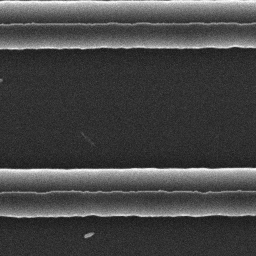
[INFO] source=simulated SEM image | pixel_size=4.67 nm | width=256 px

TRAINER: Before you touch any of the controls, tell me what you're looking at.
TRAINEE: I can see lines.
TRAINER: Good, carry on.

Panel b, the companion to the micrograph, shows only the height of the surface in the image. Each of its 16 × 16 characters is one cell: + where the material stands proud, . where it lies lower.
++++++++++++++++
++++++++++++++++
++++++++++++++++
................
................
................
................
................
................
................
................
++++++++++++++++
++++++++++++++++
+++++...........
................
................